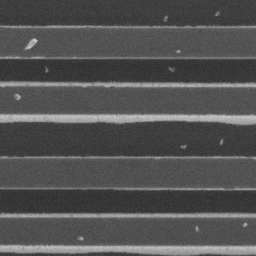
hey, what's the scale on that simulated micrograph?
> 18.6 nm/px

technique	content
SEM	lines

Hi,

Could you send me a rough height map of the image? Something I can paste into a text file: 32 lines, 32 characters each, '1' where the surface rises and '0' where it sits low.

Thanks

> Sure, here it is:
00000000000000000000000000000000
00000000000000000000000000000000
00000000000000000000000000000000
11111111111111111111111111111111
11111111111111111111111111111111
11111111111111111111111111111111
11111111111111111111111111111111
00000000000000000000000000000000
00000000000000000000000000000000
00000000000000000000000000000000
00000000000000000000000000000000
11111111111111111111111111111111
11111111111111111111111111111111
11111111111111111111111111111111
11111111111111111111111111111111
00000000000000000000000000000000
00000000000000000000000000000000
00000000000000000000000000000000
00000000000000000000000000000000
00000000000000000000000000000000
11111111111111111111111111111111
11111111111111111111111111111111
11111111111111111111111111111111
11111111111111111111111111111111
00000000000000000000000000000000
00000000000000000000000000000000
00000000000000000000000000000000
11111111111111111111111111111111
11111111111111111111111111111111
11111111111111111111111111111111
11111111111111111111111111111111
00000000000000000000000000000000